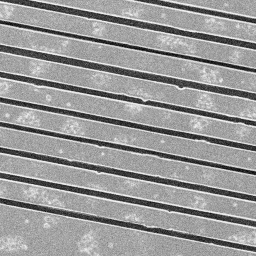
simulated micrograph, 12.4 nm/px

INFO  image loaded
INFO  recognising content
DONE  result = parallel lines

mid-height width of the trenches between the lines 7.12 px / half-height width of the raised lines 0.222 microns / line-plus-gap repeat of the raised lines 309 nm